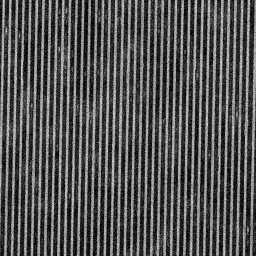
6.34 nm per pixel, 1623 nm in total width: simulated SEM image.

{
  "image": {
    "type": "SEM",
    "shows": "parallel lines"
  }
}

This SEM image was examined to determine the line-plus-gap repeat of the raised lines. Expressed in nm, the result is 42.1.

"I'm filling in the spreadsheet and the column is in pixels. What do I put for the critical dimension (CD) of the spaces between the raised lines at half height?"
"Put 4.5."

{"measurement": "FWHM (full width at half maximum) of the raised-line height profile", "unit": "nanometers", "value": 14.3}